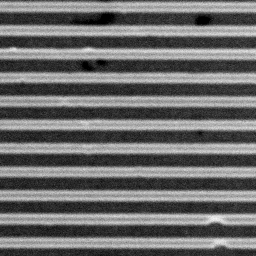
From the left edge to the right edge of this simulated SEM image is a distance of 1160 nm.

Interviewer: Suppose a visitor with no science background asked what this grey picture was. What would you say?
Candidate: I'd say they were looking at parallel lines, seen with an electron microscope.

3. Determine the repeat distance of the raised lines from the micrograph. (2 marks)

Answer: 107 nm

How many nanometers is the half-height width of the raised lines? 40.2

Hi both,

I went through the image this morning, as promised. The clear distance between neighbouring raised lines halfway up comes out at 67.9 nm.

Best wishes